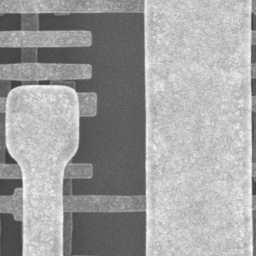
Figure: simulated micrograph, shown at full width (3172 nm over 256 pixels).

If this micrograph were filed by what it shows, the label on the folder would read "wiring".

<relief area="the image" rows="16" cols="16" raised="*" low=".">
.........*******
.........*******
.........*******
.........*******
.........*******
.***.....*******
*****....*******
*****....*******
*****....*******
.****....*******
.***.....*******
.***.....*******
.***.....*******
.***.....*******
.***.....*******
.***.....*******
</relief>